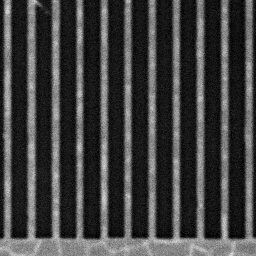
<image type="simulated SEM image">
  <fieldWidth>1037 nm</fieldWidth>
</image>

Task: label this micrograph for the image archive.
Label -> parallel lines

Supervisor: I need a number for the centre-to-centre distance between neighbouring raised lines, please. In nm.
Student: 97.8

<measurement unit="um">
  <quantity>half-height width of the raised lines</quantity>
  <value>0.0268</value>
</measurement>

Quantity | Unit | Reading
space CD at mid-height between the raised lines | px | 18